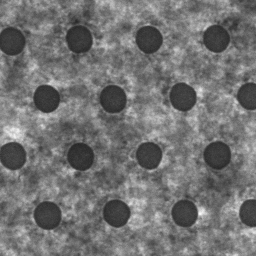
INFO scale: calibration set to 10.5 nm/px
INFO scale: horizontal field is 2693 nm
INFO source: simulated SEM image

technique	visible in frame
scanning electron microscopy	a regular array of holes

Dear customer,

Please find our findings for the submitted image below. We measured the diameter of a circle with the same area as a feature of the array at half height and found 296 nanometers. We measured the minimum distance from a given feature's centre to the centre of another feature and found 702 nanometers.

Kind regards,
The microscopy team